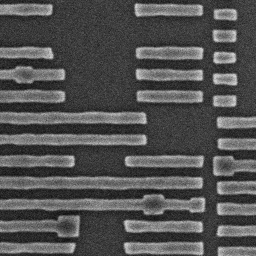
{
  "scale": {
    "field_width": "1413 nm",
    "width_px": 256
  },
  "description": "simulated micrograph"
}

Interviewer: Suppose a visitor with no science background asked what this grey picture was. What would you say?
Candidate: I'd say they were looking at wiring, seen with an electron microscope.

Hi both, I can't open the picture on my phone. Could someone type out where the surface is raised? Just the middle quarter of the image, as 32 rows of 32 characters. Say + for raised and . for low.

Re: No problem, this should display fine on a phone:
................................
..................+++.+++++.....
..................++++++++++++++
..................++++++++++++++
................................
................................
................................
..................++++++++++++++
..................++++++++++++++
............................++++
................................
................................
++++++++++++++++++++............
++++++++++++++++++++............
++++++++++++++++++++............
................................
................................
................................
++++++++++++++++++++............
++++++++++++++++++++............
................................
................................
................................
++.............+++++++++++++++++
++.............+++++++++++++++++
++..................++++++++++++
................................
................................
...+++..++++..............+++...
++++++++++++++++++++++++++++++++
++++++++++++++++++++++++++++++++
................................